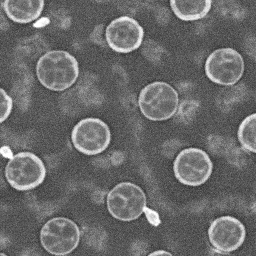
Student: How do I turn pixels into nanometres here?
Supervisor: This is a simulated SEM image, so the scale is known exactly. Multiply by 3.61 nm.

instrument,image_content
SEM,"a regular array of raised bodies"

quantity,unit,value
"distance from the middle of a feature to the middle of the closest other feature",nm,268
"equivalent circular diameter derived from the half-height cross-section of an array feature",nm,136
